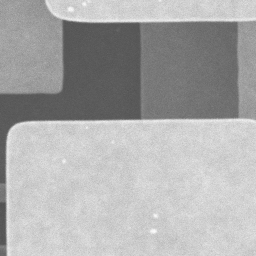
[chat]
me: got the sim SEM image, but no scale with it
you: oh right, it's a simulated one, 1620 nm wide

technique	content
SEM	wiring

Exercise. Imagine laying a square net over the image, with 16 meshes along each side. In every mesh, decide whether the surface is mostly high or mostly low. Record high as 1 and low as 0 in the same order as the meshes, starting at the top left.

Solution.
0001111111111111
0000000000000000
0000000000000000
0000000000000000
0000000000000000
0000000000000000
0000000000000000
0000000000000111
1111111111111111
1111111111111111
1111111111111111
1111111111111111
1111111111111111
1111111111111111
1111111111111111
1111111111111111